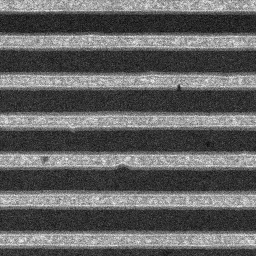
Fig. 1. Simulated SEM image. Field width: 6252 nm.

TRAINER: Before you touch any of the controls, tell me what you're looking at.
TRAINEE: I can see parallel lines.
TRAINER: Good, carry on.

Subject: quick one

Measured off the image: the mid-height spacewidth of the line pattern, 626 nanometers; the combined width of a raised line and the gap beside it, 968 nanometers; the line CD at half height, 0.333 micrometres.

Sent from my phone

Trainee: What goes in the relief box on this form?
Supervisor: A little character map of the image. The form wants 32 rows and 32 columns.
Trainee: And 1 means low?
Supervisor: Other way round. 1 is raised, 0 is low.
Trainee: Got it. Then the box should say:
11111111111111111111111111111111
01111110000000000000001111100010
00000000000000000000000000000000
00000000000000000000000000000000
11111111111111111111111111111111
11111111111111111111111111111111
00000000000000000000000000000000
00000000000000000000000000000000
00000000000000000000000000000000
11111111111111111111111111111111
11111111111111111111111111111111
00000000000000000000000000000000
00000000000000000000000000000000
00000000000000000000000000000000
11111111111111111111111111111111
11111111111111111111111111111111
00000000000000000000000000000000
00000000000000000000000000000000
00000000000000000000000000000000
11111111111111111111111111111111
11111111111111111111111111111111
00000000000000000000000000000000
00000000000000000000000000000000
00000000000000000000000000000000
11111111111111111111111111111111
11111111111111111111111111111111
00000000000000000000000000000000
00000000000000000000000000000000
00000000000000000000000000000000
11111111111111111111111111111111
11111111111111111111111111111111
00000000000000000000000000000000